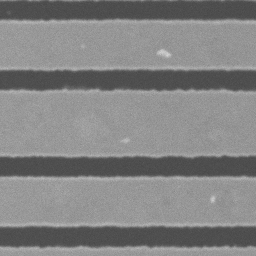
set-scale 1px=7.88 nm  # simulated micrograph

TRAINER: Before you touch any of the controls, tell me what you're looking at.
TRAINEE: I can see lines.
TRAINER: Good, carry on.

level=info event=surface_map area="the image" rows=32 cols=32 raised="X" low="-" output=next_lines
--------------------------------
--------------------------------
--------------XX------------XX--
XXXXXXXXXXXXXXXXXXXXXXXXXXXXXXXX
XXXXXXXXXXXXXXXXXXXXXXXXXXXXXXXX
XXXXXXXXXXXXXXXXXXXXXXXXXXXXXXXX
XXXXXXXXXXXXXXXXXXXXXXXXXXXXXXXX
XXXXXXXXXXXXXXXXXXXXXXXXXXXXXXXX
XXXXXXXXXXXXXXXXXXXXXXXXXXXXXXXX
--------------------------------
--------------------------------
XXXXXXXXXXXXXXXXXXXXXXXXXXXXXXXX
XXXXXXXXXXXXXXXXXXXXXXXXXXXXXXXX
XXXXXXXXXXXXXXXXXXXXXXXXXXXXXXXX
XXXXXXXXXXXXXXXXXXXXXXXXXXXXXXXX
XXXXXXXXXXXXXXXXXXXXXXXXXXXXXXXX
XXXXXXXXXXXXXXXXXXXXXXXXXXXXXXXX
XXXXXXXXXXXXXXXXXXXXXXXXXXXXXXXX
XXXXXXXXXXXXXXXXXXXXXXXXXXXXXXXX
-XX--X--XXXXXXXXX-XXX--XX--X-X--
--------------------------------
--------------------------------
XXXXXXXXXXXXXXXXXXXXXXXXXXXXXXXX
XXXXXXXXXXXXXXXXXXXXXXXXXXXXXXXX
XXXXXXXXXXXXXXXXXXXXXXXXXXXXXXXX
XXXXXXXXXXXXXXXXXXXXXXXXXXXXXXXX
XXXXXXXXXXXXXXXXXXXXXXXXXXXXXXXX
XXXXXXXXXXXXXXXXXXXXXXXXXXXXXXXX
--------------------------------
--------------------------------
--------------------------------
XXXXXXXXXXXXXXXXXXXXXXXXXXXXXXXX